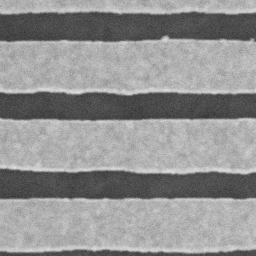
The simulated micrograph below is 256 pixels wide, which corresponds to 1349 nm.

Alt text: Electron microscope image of lines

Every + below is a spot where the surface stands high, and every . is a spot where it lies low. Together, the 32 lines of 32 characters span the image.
++++++++++++++++++++++++++++++++
................................
................................
................................
................................
++++++++++++++++++++++++++++++++
++++++++++++++++++++++++++++++++
++++++++++++++++++++++++++++++++
++++++++++++++++++++++++++++++++
++++++++++++++++++++++++++++++++
++++++++++++++++++++++++++++++++
..............+++.......+.+..+..
................................
................................
................................
++++++++++++++++++++++++++++++++
++++++++++++++++++++++++++++++++
++++++++++++++++++++++++++++++++
++++++++++++++++++++++++++++++++
++++++++++++++++++++++++++++++++
++++++++++++++++++++++++++++++++
................................
................................
................................
................................
++++++++++++++++++++++++++++++++
++++++++++++++++++++++++++++++++
++++++++++++++++++++++++++++++++
++++++++++++++++++++++++++++++++
++++++++++++++++++++++++++++++++
++++++++++++++++++++++++++++++++
................................